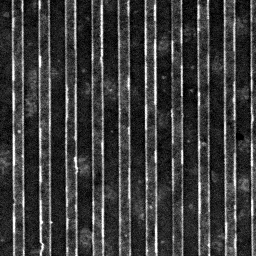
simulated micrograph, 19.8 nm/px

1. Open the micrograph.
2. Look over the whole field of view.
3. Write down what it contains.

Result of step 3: parallel lines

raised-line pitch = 26.4 px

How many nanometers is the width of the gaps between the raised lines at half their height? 321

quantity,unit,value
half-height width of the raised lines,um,0.205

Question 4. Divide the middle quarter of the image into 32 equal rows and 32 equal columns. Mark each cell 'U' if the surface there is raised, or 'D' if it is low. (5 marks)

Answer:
UUUDDDDUUDDDDDUUDDDDUUUDDDDUUDDD
UUUDDDDUUDDDDDUUDDDDUUUDDDDUUDDD
UUUDDDDUUDDDDDUUDDDDUUUDDDDUUDDD
UUUDDDDUUDDDDDUUDDDDUUUDDDDUUDDD
UUUDDDDUUDDDDDUUDDDDUUUDDDDUUDDD
UUUDDDDUUDDDDDUUDDDDUUUDDDDUUDDD
UUUDDDDUUDDDDDUUDDDDUUUDDDDUUDDD
DUUDDDDUUDDDDDUUDDDDUUUDDDDUUDDD
DUUDDDDUUDDDDDUUDDDDUUUDDDDUUDDD
DUUDDDDUUUDDDDUUDDDDUUUDDDDUUDDD
DUUDDDDUUUDDDDUUDDDDUUUDDDDUUDDD
DUUDDDDUUUDDDDUUDDDDUUUDDDDUUDDD
DUUDDDDUUUDDDDUUDDDDDUUDDDDUUUDD
DUUDDDDUUUDDDDUUDDDDDUUDDDDUUUDD
DUUDDDDUUUDDDDUUDDDDDUUDDDDUUDDD
DUUDDDDUUUDDDDUUDDDDDUUDDDDUUUDD
DUUDDDDUUUDDDDUUDDDDDUUDDDDUUUDD
DUUDDDDUUUDDDDUUDDDDDUUDDDDUUUDD
DUUDDDDUUUDDDDUUDDDDDUUDDDDUUUDD
DUUDDDDUUUDDDDUUDDDDDUUDDDDUUUDD
DUUDDDDUUUDDDDUUDDDDDUUDDDDUUUDD
DUUDDDDUUUDDDDUUDDDDDUUDDDDUUUDD
DUUDDDDUUUDDDDUUDDDDDUUDDDDUUUDD
DUUDDDDUUUDDDDUUDDDDDUUDDDDUUUDD
DUUDDDDUUUDDDDUUDDDDDUUDDDDUUUDD
DUUDDDDUUUDDDDUUDDDDDUUDDDDUUUDD
DUUDDDDUUUDDDDUUDDDDDUUDDDDUUUDD
DUUDDDDUUUDDDDUUDDDDDUUDDDDUUUDD
DUUDDDDUUUDDDDUUDDDDDUUDDDDUUUDD
DUUDDDDUUUDDDDUUDDDDDUUDDDDUUUDD
DUUDDDDUUUDDDDUUDDDDDUUDDDDUUUDD
DUUDDDDUUUDDDDUUDDDDDUUDDDDUUUDD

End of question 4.